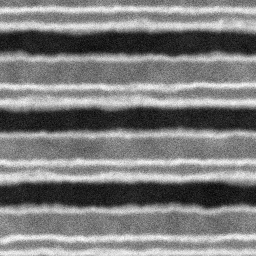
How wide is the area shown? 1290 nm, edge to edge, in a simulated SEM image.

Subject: lines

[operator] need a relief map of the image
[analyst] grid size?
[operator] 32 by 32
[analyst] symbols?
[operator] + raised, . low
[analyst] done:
++++++++++++++++++++++++++++++++
++++++++++++++++++++++++++++++++
++++++++++++++++++++++++++++++++
++++++.++++++++...++..+.......++
................................
................................
................................
++++++++++++++++++++++++++++++++
++++++++++++++++++++++++++++++++
++++++++++++++++++++++++++++++++
++++++++++++++++++++++++++++++++
++++++++++++++++++++++++++++++++
++++++++++++++++++++++++++++++++
................................
................................
................................
................................
++++++++++++++++++++++++++++++++
++++++++++++++++++++++++++++++++
++++++++++++++++++++++++++++++++
++++++++++++++++++++++++++++++++
++++++++++++++++++++++++++++++++
+........+......................
................................
................................
................................
++++++++++++++++++++++++++++++++
++++++++++++++++++++++++++++++++
++++++++++++++++++++++++++++++++
++++++++++++++++++++++++++++++++
++++++++++++++++++++++++++++++++
++++++++++++++++++++++++++++++++